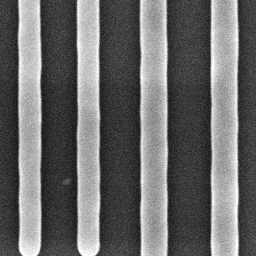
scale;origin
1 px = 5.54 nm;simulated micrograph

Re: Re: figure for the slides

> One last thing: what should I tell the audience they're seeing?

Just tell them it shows groups of lines, slits or small figures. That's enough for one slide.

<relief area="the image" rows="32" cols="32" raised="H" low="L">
LLHHHLLLLLHHLLLLLLHHHLLLLLHHHHLL
LLHHHLLLLLHHLLLLLLHHHLLLLLHHHHLL
LLLHHLLLLLHHLLLLLLHHHLLLLLHHHHLL
LLHHHLLLLLHHLLLLLLHHHLLLLLHHHHLL
LLHHHLLLLLHHLLLLLLHHHLLLLLHHHHLL
LLHHHLLLLLHHLLLLLLHHHLLLLLHHHHLL
LLHHHLLLLLHHLLLLLLHHHLLLLLHHHHLL
LLHHHLLLLLHHLLLLLLHHHLLLLLHHHHLL
LLHHHLLLLLHHLLLLLLHHHLLLLLHHHHLL
LLHHHLLLLLHHLLLLLLHHHLLLLLHHHHLL
LLHHHLLLLLHHLLLLLLHHHLLLLLHHHHLL
LLHHHLLLLLHHLLLLLLHHHLLLLLHHHHLL
LLHHHLLLLLHHLLLLLLHHHLLLLLHHHHLL
LLHHHLLLLLHHLLLLLLHHHLLLLLHHHHLL
LLHHHLLLLLHHLLLLLLHHHLLLLLHHHHLL
LLHHHLLLLLHHLLLLLLHHHLLLLLHHHHLL
LLHHHLLLLLHHLLLLLLHHHLLLLLHHHHLL
LLLHHLLLLLHHLLLLLLHHHLLLLLHHHHLL
LLHHHLLLLLHHLLLLLLHHHLLLLLLHHHLL
LLHHHLLLLLHHLLLLLLHHHLLLLLLHHHLL
LLHHHLLLLLHHLLLLLLHHHLLLLLHHHHLL
LLHHHLLLLLHHLLLLLLHHHLLLLLHHHHLL
LLLHHLLLLLHHLLLLLLHHHLLLLLHHHHLL
LLLHHLLLLLHHLLLLLLHHHLLLLLHHHHLL
LLHHHLLLLLHHLLLLLLHHHLLLLLLHHHLL
LLHHHLLLLLHHLLLLLLHHHLLLLLLHHHLL
LLLHHLLLLLHHLLLLLLHHHLLLLLHHHHLL
LLLHHLLLLLHHLLLLLLHHHLLLLLHHHHLL
LLLHHLLLLLHHLLLLLLHHHLLLLLHHHHLL
LLLHHLLLLLHHLLLLLLHHHLLLLLHHHHLL
LLHHHLLLLLHHLLLLLLHHHLLLLLHHHHLL
LLLHHLLLLLHHLLLLLLHHHLLLLLHHHHLL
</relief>